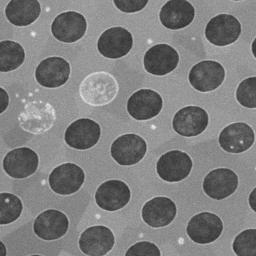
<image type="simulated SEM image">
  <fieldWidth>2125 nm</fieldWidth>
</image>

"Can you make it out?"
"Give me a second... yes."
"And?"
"a regular array of holes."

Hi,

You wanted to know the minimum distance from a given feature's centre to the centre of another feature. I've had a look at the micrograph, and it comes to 0.399 µm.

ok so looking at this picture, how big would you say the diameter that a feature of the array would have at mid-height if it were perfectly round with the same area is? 281 nanometres